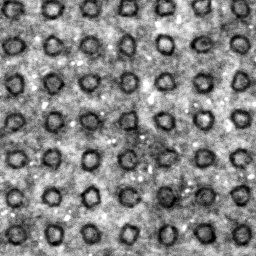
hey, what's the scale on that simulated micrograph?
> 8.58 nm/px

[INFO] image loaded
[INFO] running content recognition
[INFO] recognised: a regular array of ring-shaped raised bodies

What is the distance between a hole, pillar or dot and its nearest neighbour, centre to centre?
315 nanometres